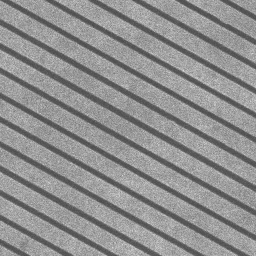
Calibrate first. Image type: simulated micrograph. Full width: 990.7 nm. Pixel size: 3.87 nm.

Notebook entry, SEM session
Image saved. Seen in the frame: parallel lines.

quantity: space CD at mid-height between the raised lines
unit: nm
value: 21.1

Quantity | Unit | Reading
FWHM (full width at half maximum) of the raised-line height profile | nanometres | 63.8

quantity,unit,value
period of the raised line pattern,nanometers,82.7